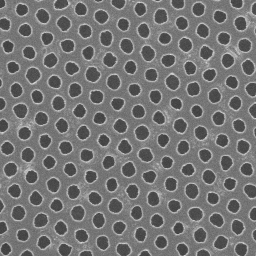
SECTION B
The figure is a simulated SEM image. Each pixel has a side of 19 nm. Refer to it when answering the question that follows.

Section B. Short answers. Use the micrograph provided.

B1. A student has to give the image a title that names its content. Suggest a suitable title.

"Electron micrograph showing a regular array of holes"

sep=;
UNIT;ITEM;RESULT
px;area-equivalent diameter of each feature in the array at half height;12.7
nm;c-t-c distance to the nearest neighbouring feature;412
